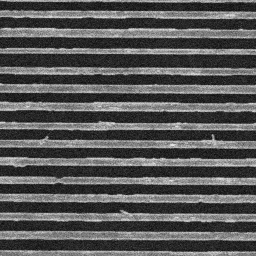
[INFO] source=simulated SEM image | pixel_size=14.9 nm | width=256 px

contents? parallel lines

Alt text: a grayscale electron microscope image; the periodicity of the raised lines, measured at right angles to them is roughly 274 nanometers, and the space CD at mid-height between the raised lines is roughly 184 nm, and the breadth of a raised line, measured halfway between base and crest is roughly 85.5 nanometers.